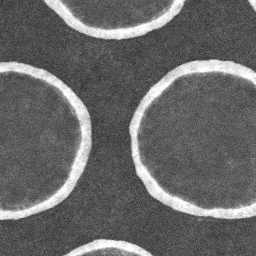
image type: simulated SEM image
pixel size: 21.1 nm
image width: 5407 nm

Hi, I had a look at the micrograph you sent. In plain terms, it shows raised bodies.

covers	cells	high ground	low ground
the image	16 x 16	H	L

LLLLHHHHHHHLLLLL
LLLLLHHHHHLLLLLL
LLLLLLLLLLLLLLLL
LLLLLLLLLLLLLLLL
HHLLLLLLLLLHHHHL
HHHHLLLLLLHHHHHH
HHHHHLLLLHHHHHHH
HHHHHLLLHHHHHHHH
HHHHHLLLHHHHHHHH
HHHHHLLLHHHHHHHH
HHHHHLLLLHHHHHHH
HHHHLLLLLHHHHHHH
HHHLLLLLLLLHHHHH
LLLLLLLLLLLLLLLL
LLLLLLLLLLLLLLLL
LLLLLHHHLLLLLLLL